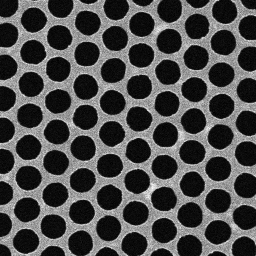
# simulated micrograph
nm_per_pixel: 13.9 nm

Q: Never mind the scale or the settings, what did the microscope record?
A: a regular array of holes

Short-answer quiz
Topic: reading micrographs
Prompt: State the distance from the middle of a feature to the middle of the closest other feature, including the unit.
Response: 0.426 um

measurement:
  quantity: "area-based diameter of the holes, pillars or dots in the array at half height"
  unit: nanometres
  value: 354